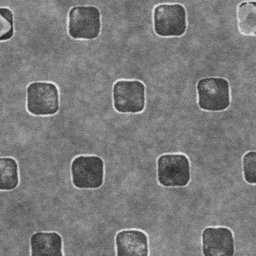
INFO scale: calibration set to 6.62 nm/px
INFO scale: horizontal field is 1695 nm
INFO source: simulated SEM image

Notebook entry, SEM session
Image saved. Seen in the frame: holes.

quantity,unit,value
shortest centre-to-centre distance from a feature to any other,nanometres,567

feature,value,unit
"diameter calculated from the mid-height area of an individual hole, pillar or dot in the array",233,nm